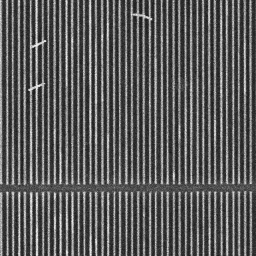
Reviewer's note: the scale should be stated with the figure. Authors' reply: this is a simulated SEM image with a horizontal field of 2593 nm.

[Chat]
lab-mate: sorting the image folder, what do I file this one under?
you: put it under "parallel lines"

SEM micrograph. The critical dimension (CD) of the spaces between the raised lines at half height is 46.9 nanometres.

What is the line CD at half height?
19 nm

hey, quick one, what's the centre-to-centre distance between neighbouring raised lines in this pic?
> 60.1 nm